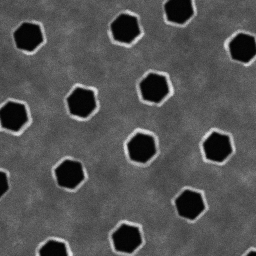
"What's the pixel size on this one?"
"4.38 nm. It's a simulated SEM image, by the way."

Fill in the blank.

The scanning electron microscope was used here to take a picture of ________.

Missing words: a regular array of holes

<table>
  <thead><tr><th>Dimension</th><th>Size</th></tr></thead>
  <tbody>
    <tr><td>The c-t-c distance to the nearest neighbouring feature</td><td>290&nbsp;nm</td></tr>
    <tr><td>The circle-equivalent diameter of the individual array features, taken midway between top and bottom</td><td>0.121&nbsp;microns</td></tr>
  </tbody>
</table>